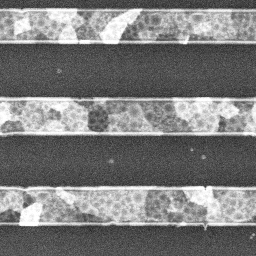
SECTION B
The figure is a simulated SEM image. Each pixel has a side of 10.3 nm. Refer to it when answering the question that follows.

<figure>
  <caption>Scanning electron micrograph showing one or a few lines or trenches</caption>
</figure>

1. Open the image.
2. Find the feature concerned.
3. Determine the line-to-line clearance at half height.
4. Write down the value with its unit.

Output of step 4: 590 nm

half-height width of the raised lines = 344 nanometers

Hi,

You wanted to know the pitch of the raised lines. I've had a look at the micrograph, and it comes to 928 nm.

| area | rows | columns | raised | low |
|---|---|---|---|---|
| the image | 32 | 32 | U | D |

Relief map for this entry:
DDDDDDDDDDDDDDDDDDDDDDDDDDDDDDDD
UUUUUUUUUUUUUUUUUUUUUUUUUUUUUUUU
UUUUUUUUUUUUUUUUUUUUUUUUUUUUUUUU
UUUUUUUUUUUUUUUUUUUUUUUUUUUUUUUU
UUUUUUUUUUUUUUUUUUUUUUUUUUUUUUUU
DDDDDDDDDDDDDDDDDDDDDDDDDDDDDDDD
DDDDDDDDDDDDDDDDDDDDDDDDDDDDDDDD
DDDDDDDDDDDDDDDDDDDDDDDDDDDDDDDD
DDDDDDDDDDDDDDDDDDDDDDDDDDDDDDDD
DDDDDDDDDDDDDDDDDDDDDDDDDDDDDDDD
DDDDDDDDDDDDDDDDDDDDDDDDDDDDDDDD
DDDDDDDDDDDDDDDDDDDDDDDDDDDDDDDD
UUUUUUUDUUDDDUUUUDDDDDDDDDDDDDDD
UUUUUUUUUUUUUUUUUUUUUUUUUUUUUUUU
UUUUUUUUUUUUUUUUUUUUUUUUUUUUUUUU
UUUUUUUUUUUUUUUUUUUUUUUUUUUUUUUU
UUUUUUUUUUUUUUUUUUUUUUUUUUUUUUUU
DDDDDDDDDDDDDDDDDDDDDDDDDDDDDDDD
DDDDDDDDDDDDDDDDDDDDDDDDDDDDDDDD
DDDDDDDDDDDDDDDDDDDDDDDDDDDDDDDD
DDDDDDDDDDDDDDDDDDDDDDDDDDDDDDDD
DDDDDDDDDDDDDDDDDDDDDDDDDDDDDDDD
DDDDDDDDDDDDDDDDDDDDDDDDDDDDDDDD
DDDDDDDDDDDDDDDDDDDDDDDDDDDDDDDD
UUUUUUUUUUUUUUUUUUUUUUUUUUUUUUUU
UUUUUUUUUUUUUUUUUUUUUUUUUUUUUUUU
UUUUUUUUUUUUUUUUUUUUUUUUUUUUUUUU
UUUUUUUUUUUUUUUUUUUUUUUUUUUUUUUU
DDDDDDDDDDDDDDDDDDDDDDDDDDDDDDDD
DDDDDDDDDDDDDDDDDDDDDDDDDDDDDDDD
DDDDDDDDDDDDDDDDDDDDDDDDDDDDDDDD
DDDDDDDDDDDDDDDDDDDDDDDDDDDDDDDD